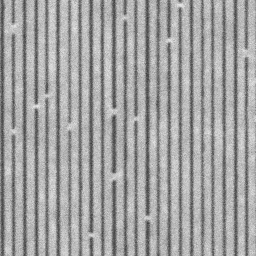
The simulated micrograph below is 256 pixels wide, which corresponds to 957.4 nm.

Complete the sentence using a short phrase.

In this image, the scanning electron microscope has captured parallel lines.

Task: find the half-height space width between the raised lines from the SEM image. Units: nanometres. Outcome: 13.6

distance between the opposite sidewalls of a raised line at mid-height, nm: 27.1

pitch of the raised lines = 41.5 nanometers